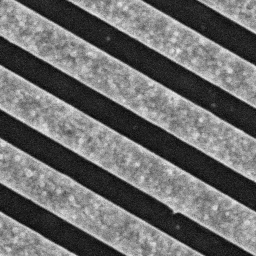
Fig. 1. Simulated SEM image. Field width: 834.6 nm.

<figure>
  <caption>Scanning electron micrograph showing one or a few lines or trenches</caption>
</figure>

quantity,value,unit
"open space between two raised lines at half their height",85.4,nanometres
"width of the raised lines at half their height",122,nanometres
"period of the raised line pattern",0.206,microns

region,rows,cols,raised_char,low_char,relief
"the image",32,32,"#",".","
###......#########........######
####.......#########.......#####
######.......#########.......###
########.......########........#
#########.......#########.......
..#########.......#########.....
....#########.......#########...
.....##########.......########..
#......#########.......#########
##.......#########.......#######
####.......#########.......#####
######......##########.......###
########......#########.......##
#########.......#########.......
..#########.......#########.....
...##########......##########...
.....#########.......#########..
.......#########.......#########
##.......#########.......#######
####......##########......######
######......#########.......####
#######.......#########.......##
#########.......#########.......
.##########......##########.....
...#########.......#########....
.....#########.......#########..
.......#########......##########
##......##########......########
###.......#########.......######
#####.......#########.......####
#######.......#########......###
#########......##########......#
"